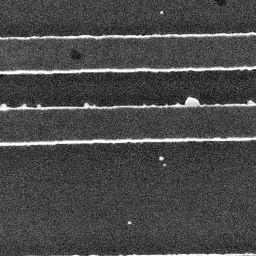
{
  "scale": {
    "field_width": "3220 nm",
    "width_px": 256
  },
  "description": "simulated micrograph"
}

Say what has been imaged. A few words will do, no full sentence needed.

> lines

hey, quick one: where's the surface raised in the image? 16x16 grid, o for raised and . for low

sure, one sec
................
................
oooooooooooooooo
oooooooooooooooo
ooooo...........
................
...........oo...
oooooooooooooooo
oooooooooooooooo
................
................
................
................
................
................
................